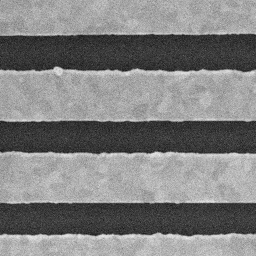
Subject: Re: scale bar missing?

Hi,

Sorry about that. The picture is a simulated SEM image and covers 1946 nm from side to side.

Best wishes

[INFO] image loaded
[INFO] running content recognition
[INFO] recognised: lines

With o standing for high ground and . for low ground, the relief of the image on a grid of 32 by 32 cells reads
oooooooooooooooooooooooooooooooo
oooooooooooooooooooooooooooooooo
oooooooooooooooooooooooooooooooo
oooooooooooooooooooooooooooooooo
................................
................................
................................
................................
................................
oooooooooooooooooooooooooooooooo
oooooooooooooooooooooooooooooooo
oooooooooooooooooooooooooooooooo
oooooooooooooooooooooooooooooooo
oooooooooooooooooooooooooooooooo
oooooooooooooooooooooooooooooooo
................................
................................
................................
................................
oooooooooooooooooooooooooooooooo
oooooooooooooooooooooooooooooooo
oooooooooooooooooooooooooooooooo
oooooooooooooooooooooooooooooooo
oooooooooooooooooooooooooooooooo
oooooooooooooooooooooooooooooooo
................................
................................
................................
................................
ooooooooooo.ooooooooooo.oooooooo
oooooooooooooooooooooooooooooooo
oooooooooooooooooooooooooooooooo